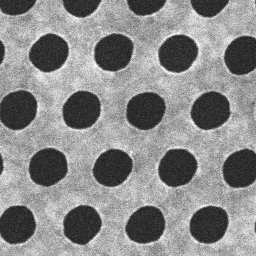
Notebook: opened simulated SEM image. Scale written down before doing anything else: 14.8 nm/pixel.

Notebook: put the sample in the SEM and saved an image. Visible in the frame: a regular array of holes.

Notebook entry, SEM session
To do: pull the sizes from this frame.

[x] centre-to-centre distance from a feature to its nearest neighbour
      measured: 953 nanometers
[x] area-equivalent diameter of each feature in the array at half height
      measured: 39.2 px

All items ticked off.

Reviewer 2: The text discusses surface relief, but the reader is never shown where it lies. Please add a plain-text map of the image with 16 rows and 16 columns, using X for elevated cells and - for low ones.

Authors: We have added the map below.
--XX--XX--XX--XX
XXXXXXXXXXXXXXXX
XX--XX--XX--XXX-
XX--XX--XX--XX--
XXXXXXXXXXXXXX--
XXXXXXXXXXXXXXXX
--XX--XX--XX--XX
--XX--XX--XX--XX
XXXXXXXXXXXXXXXX
XX--XX--XXX-XXX-
XX--XX--XX--XX--
XX-XXX--XX--XX--
XXXXXXXXXXXXXXXX
--XX--XX--XX--XX
--XX--XX--XX--XX
XXXXXXXXXXXXXXXX